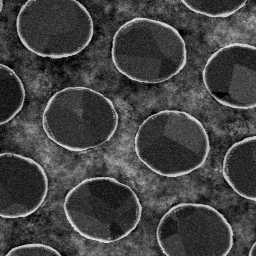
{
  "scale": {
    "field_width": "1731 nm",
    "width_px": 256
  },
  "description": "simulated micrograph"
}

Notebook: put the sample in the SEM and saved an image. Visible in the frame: raised bodies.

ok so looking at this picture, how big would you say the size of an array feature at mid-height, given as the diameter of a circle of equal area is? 463 nm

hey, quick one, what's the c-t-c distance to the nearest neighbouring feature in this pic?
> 639 nm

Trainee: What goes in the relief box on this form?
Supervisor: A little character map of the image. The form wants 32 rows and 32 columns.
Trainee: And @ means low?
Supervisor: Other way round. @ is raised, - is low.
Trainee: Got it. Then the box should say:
---@@@@@@@-------------@@@@@@@@-
---@@@@@@@@--------------@@@@---
--@@@@@@@@@------@@-------------
--@@@@@@@@@----@@@@@@-----------
--@@@@@@@@@---@@@@@@@@----------
---@@@@@@@@---@@@@@@@@@---------
----@@@@@@----@@@@@@@@@----@@@@@
--------------@@@@@@@@@---@@@@@@
@--------------@@@@@@@@---@@@@@@
@@--------------@@@@@@----@@@@@@
@@@-----------------------@@@@@@
@@@----@@@@@--------------@@@@@@
@@@---@@@@@@@--------------@@@@@
@@@---@@@@@@@@------------------
@@---@@@@@@@@@@----@@@@@--------
-----@@@@@@@@@@---@@@@@@@-------
------@@@@@@@@---@@@@@@@@@------
-------@@@@@@----@@@@@@@@@-----@
---------@@------@@@@@@@@@---@@@
@@---------------@@@@@@@@@--@@@@
@@@@@-------------@@@@@@@---@@@@
@@@@@---------------@@@@----@@@@
@@@@@@-----@@@--------------@@@@
@@@@@@---@@@@@@@-------------@@@
@@@@@@---@@@@@@@@-------------@@
@@@@@---@@@@@@@@@------@--------
@@@@----@@@@@@@@@@---@@@@@@-----
---------@@@@@@@@---@@@@@@@@----
---------@@@@@@@@---@@@@@@@@@---
-----------@@@@@----@@@@@@@@@---
--------------------@@@@@@@@@---
-@@@@@@-------------@@@@@@@@---@